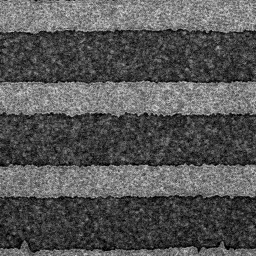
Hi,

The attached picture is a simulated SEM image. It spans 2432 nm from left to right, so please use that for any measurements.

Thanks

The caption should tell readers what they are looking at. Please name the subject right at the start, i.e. one or a few lines or trenches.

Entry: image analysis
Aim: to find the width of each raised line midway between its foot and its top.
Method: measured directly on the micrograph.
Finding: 29.7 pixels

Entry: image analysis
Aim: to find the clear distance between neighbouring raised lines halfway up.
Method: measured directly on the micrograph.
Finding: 494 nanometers